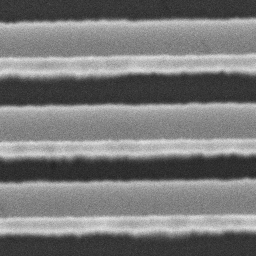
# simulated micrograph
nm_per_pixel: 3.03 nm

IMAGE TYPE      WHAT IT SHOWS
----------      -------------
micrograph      lines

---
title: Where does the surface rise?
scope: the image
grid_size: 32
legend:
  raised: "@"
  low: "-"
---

--------------------------------
--------------------------------
-----------------------------@-@
@@@@@@@@@@@@@@@@@@@@@@@@@@@@@@@@
@@@@@@@@@@@@@@@@@@@@@@@@@@@@@@@@
@@@@@@@@@@@@@@@@@@@@@@@@@@@@@@@@
@@@@@@@@@@@@@@@@@@@@@@@@@@@@@@@@
@@@@@@@@@@@@@@@@@@@@@@@@@@@@@@@@
@@@@@@@@@@@@@@@@@@@@@@@@@@@@@@@@
--------------------------------
--------------------------------
--------------------------------
--------------------------------
@@@@@@@@@@@@@@@@@@@@@@@@@@@@@@@@
@@@@@@@@@@@@@@@@@@@@@@@@@@@@@@@@
@@@@@@@@@@@@@@@@@@@@@@@@@@@@@@@@
@@@@@@@@@@@@@@@@@@@@@@@@@@@@@@@@
@@@@@@@@@@@@@@@@@@@@@@@@@@@@@@@@
@@@@@@@@@@@@@@@@@@@@@@@@@@@@@@@@
@@------@-----------------------
--------------------------------
--------------------------------
--------------------------------
@@@@@@@@@@@@@@@@@@@@@@@@@@@@@@@@
@@@@@@@@@@@@@@@@@@@@@@@@@@@@@@@@
@@@@@@@@@@@@@@@@@@@@@@@@@@@@@@@@
@@@@@@@@@@@@@@@@@@@@@@@@@@@@@@@@
@@@@@@@@@@@@@@@@@@@@@@@@@@@@@@@@
@@@@@@@@@@@@@@@@@@@@@@@@@@@@@@@@
--------------------------------
--------------------------------
--------------------------------